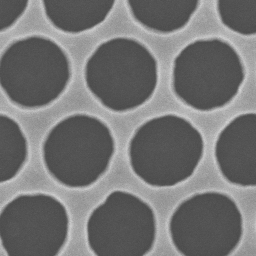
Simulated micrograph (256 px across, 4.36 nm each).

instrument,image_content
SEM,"holes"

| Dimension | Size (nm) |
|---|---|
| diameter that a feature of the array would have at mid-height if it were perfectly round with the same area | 314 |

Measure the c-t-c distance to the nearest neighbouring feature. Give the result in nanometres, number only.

377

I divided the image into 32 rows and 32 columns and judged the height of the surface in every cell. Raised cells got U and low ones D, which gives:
DDDUUDDDDDDDDDUUDDDDDDDDDUUDDDDD
DDDUUUDDDDDDDDUUDDDDDDDDUUUDDDDD
DDUUUUDDDDDDDUUUUDDDDDDDUUUUDDDD
DUUUUUUDDDDUUUUUUUDDDDDUUUUUUDDD
UUUUDUUUUUUUUUUUUUUUUUUUUUUUUUUU
UDDDDDDUUUUUUDDDDDUUUUUUDDDDDUUU
UDDDDDDDUUUUDDDDDDDUUUUDDDDDDDUU
DDDDDDDDDUUDDDDDDDDUUUDDDDDDDDUU
DDDDDDDDDUUDDDDDDDDDUUDDDDDDDDUU
DDDDDDDDDUUDDDDDDDDDUUDDDDDDDDDU
DDDDDDDDUUUDDDDDDDDDUUDDDDDDDDUU
UDDDDDDDUUUDDDDDDDDUUUDDDDDDDDUU
UDDDDDDUUUUUDDDDDDUUUUUDDDDDDUUU
UUUDUUUUUUUUUDDDDUUUUUUUDDDUUUUU
DUUUUUUUUDDUUUUUUUUUDDUUUUUUUUDD
DDUUUUUDDDDDDUUUUUDDDDDDUUUUUDDD
DDDUUUDDDDDDDDUUUDDDDDDDDUUUDDDD
DDDUUUDDDDDDDDUUDDDDDDDDDUUDDDDD
DDDUUDDDDDDDDDUUDDDDDDDDDUUDDDDD
DDDUUDDDDDDDDDUUDDDDDDDDDUUDDDDD
DDDUUUDDDDDDDDUUDDDDDDDDDUUDDDDD
DDUUUUDDDDDDDUUUUDDDDDDDUUUUDDDD
DUUUUUUDDDDDUUUUUUDDDDDUUUUUDDDD
UUUUUUUUUUUUUUUUUUUUUUUUUUUUUUUU
UUDDDDUUUUUUUUDDDUUUUUUUDDDDUUUU
UDDDDDDDUUUUUDDDDDUUUUUDDDDDDUUU
DDDDDDDDUUUUDDDDDDDUUUDDDDDDDDUU
DDDDDDDDDUUDDDDDDDDUUDDDDDDDDDUU
DDDDDDDDUUUDDDDDDDDDUDDDDDDDDDUU
DDDDDDDDUUUDDDDDDDDUUDDDDDDDDDUU
DDDDDDDDUUUDDDDDDDDUUUDDDDDDDDUU
UDDDDDDUUUUUDDDDDDDUUUDDDDDDDUUU